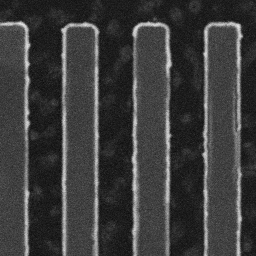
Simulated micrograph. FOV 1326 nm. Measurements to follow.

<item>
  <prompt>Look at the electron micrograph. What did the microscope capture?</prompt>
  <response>one or a few lines or trenches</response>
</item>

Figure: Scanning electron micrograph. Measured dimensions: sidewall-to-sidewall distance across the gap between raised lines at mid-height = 35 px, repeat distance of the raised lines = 71.1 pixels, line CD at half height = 182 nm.